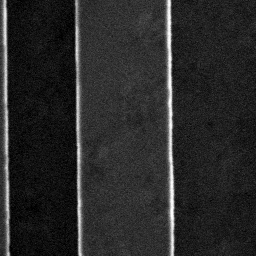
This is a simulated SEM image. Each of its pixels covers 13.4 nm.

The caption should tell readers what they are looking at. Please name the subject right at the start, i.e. lines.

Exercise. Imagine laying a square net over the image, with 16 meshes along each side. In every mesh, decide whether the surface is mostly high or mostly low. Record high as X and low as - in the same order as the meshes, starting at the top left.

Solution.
-----XXXXXX-----
-----XXXXXX-----
-----XXXXXX-----
-----XXXXXX-----
-----XXXXXX-----
-----XXXXXX-----
-----XXXXXX-----
-----XXXXXX-----
-----XXXXXX-----
-----XXXXXX-----
-----XXXXXX-----
-----XXXXXX-----
-----XXXXXX-----
X----XXXXXX-----
X----XXXXXX-----
X----XXXXXX-----